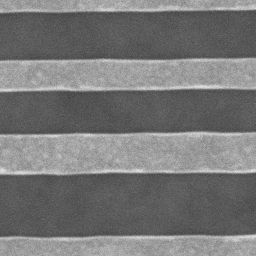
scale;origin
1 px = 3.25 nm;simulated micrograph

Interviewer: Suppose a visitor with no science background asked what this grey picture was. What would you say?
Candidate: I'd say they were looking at groups of lines, slits or small figures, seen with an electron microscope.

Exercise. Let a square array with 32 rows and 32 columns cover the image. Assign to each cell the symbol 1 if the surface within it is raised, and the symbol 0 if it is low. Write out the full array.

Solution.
11111111111111111111111111111111
10000000000000000000000000000000
00000000000000000000000000000000
00000000000000000000000000000000
00000000000000000000000000000000
00000000000000000000000000000000
00000000000000000000000000000000
00000000000000000000000000011111
11111111111111111111111111111111
11111111111111111111111111111111
11111111111111111111111111111111
00000000000000000000000000000000
00000000000000000000000000000000
00000000000000000000000000000000
00000000000000000000000000000000
00000000000000000000000000000000
00000000000000000000000000000000
11111111111111111111111111111111
11111101111111111111111111111111
11111111111111111111111111111111
11001111111111111011111111111111
11011111111110001011111100001110
00000000000000000000000000000000
00000000000000000000000000000000
00000000000000000000000000000000
00000000000000000000000000000000
00000000000000000000000000000000
00000000000000000000000000000000
00000000000000000000000000000000
00000000000000000000000000000000
11111110011111111111111111111111
11111111111111111111000111111110